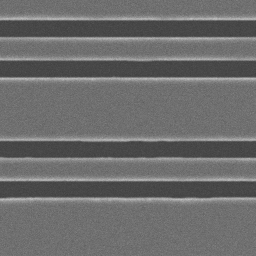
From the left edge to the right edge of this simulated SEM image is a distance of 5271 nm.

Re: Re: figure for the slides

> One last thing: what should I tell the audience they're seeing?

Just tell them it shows lines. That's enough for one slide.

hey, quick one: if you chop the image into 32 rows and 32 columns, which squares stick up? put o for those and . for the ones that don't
oooooooooooooooooooooooooooooooo
oooooooooooooooooooooooooooooooo
................................
................................
................................
oooooooooooooooooooooooooooooooo
oooooooooooooooooooooooooooooooo
.................oo.............
................................
................................
oooooooooooooooooooooooooooooooo
oooooooooooooooooooooooooooooooo
oooooooooooooooooooooooooooooooo
oooooooooooooooooooooooooooooooo
oooooooooooooooooooooooooooooooo
oooooooooooooooooooooooooooooooo
oooooooooooooooooooooooooooooooo
oooooooooooooooooooooooooooooooo
................................
................................
oooooooooooooooooooooooooooooooo
oooooooooooooooooooooooooooooooo
oooooooooooooooooooooooooooooooo
................................
................................
oooooooooooooooooooooooooooooooo
oooooooooooooooooooooooooooooooo
oooooooooooooooooooooooooooooooo
oooooooooooooooooooooooooooooooo
oooooooooooooooooooooooooooooooo
oooooooooooooooooooooooooooooooo
oooooooooooooooooooooooooooooooo